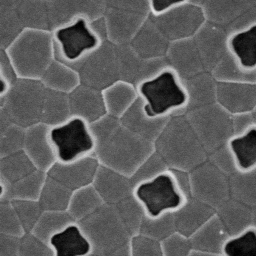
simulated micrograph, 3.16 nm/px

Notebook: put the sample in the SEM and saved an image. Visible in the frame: holes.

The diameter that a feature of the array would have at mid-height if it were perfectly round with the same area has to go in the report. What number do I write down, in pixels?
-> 38.5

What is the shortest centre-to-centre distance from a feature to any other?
0.318 µm